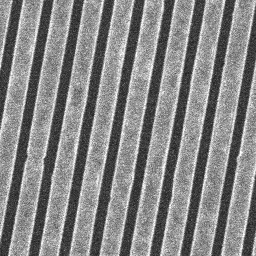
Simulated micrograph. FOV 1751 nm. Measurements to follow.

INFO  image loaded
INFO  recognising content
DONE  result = parallel lines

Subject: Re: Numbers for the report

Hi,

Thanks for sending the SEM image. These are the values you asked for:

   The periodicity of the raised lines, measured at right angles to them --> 204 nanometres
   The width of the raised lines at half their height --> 126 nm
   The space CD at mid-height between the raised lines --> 0.0783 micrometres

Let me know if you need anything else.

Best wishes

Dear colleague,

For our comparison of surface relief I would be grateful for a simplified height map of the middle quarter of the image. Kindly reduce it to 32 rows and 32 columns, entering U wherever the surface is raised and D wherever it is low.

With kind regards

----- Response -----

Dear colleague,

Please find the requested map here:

DDUUUUUDDDUUUUDDDUUUUUDDDUUUUUDD
DDUUUUUDDDUUUUDDDUUUUUDDDUUUUUDD
DDUUUUDDDDUUUUDDDUUUUUDDDUUUUDDD
DDUUUUDDDUUUUUDDDUUUUDDDDUUUUDDD
DDUUUUDDDUUUUUDDDUUUUDDDUUUUUDDD
DDUUUUDDDUUUUUDDUUUUUDDDUUUUUDDD
DUUUUUDDDUUUUUDDUUUUUDDDUUUUUDDD
DUUUUUDDDUUUUDDDUUUUUDDDUUUUUDDU
DUUUUUDDDUUUUDDDUUUUUDDDUUUUDDDU
DUUUUDDDUUUUUDDDUUUUDDDDUUUUDDDU
DUUUUDDDUUUUUDDDUUUUDDDUUUUUDDDU
UUUUUDDDUUUUUDDUUUUUDDDUUUUUDDDU
UUUUUDDDUUUUDDDUUUUUDDDUUUUUDDDU
UUUUDDDDUUUUDDDUUUUUDDDUUUUDDDUU
UUUUDDDDUUUUDDDUUUUDDDDUUUUDDDUU
UUUUDDDUUUUUDDDUUUUDDDDUUUUDDDUU
UUUUDDDUUUUUDDDUUUUDDDUUUUUDDDUU
UUUUDDDUUUUDDDDUUUUDDDUUUUUDDDUU
UUUUDDDUUUUDDDUUUUUDDDUUUUDDDDUU
UUUDDDDUUUUDDDUUUUUDDDUUUUDDDUUU
UUUDDDUUUUUDDDUUUUDDDDUUUUDDDUUU
UUUDDDUUUUUDDDUUUUDDDUUUUUDDDUUU
UUUDDDUUUUDDDDUUUUDDDUUUUUDDDUUU
UUUDDDUUUUDDDDUUUUDDDUUUUDDDDUUU
UUDDDDUUUUDDDUUUUUDDDUUUUDDDDUUU
UUDDDDUUUUDDDUUUUUDDDUUUUDDDUUUU
UUDDDUUUUUDDDUUUUDDDDUUUUDDDUUUU
UUDDDUUUUUDDDUUUUDDDUUUUUDDDUUUU
UUDDDUUUUDDDDUUUUDDDUUUUUDDDUUUU
UUDDDUUUUDDDUUUUUDDDUUUUDDDUUUUU
UUDDDUUUUDDDUUUUUDDDUUUUDDDUUUUU
UDDDUUUUUDDDUUUUUDDDUUUUDDDUUUUU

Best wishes